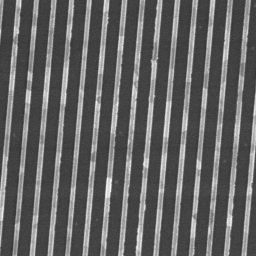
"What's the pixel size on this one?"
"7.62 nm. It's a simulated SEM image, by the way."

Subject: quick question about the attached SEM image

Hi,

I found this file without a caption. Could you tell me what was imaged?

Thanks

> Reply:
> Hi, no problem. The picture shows parallel lines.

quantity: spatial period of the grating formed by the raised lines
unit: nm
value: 134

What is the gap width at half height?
102 nanometers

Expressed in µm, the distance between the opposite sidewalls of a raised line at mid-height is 0.0275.